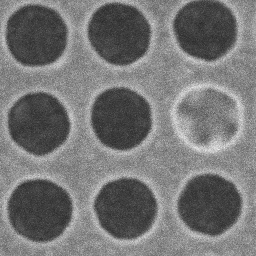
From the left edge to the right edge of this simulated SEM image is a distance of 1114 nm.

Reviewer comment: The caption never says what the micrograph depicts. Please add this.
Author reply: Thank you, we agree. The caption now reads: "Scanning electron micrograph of holes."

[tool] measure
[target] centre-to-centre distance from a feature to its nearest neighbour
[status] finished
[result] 361 nm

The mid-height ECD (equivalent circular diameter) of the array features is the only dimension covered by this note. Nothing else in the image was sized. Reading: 278 nanometers